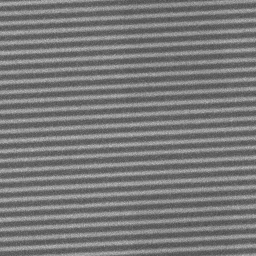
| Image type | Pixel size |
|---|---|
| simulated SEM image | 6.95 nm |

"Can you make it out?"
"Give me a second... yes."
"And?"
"parallel lines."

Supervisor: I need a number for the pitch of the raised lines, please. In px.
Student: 9.8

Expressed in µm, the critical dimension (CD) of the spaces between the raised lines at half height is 0.0469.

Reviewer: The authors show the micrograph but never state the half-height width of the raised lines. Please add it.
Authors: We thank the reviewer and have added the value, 0.02 µm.